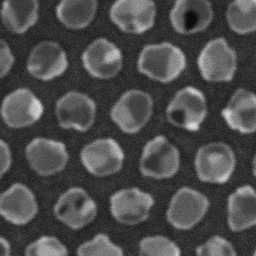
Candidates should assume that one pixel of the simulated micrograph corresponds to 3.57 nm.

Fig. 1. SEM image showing a regular array of raised bodies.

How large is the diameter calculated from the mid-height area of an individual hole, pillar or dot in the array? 136 nm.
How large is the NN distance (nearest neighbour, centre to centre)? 0.193 um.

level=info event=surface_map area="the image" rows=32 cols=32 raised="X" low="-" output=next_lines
-XXXX---XXXX---XXXX---XXXX---XXX
XXXX---XXXXX--XXXXX---XXXXX-XXXX
XXXX----XXX---XXXXX--XXXXX--XXXX
-XX------X-----XXX----XXXX---XXX
--------------------------------
X----XX----XXX------------XX----
X---XXXX---XXXX---XXXXX--XXXX---
X---XXXX---XXXX---XXXXX--XXXX---
X---XXXX---XXXX---XXXXX--XXXX---
----XXX-----XX-----XXX---XXXX---
--------------------------------
--XX------------XX-----XX-----X-
-XXXX---XXX----XXXX---XXX----XXX
XXXXX--XXXXX--XXXXX--XXXXX--XXXX
XXXXX--XXXXX--XXXXX--XXXX---XXXX
-XXX---XXXX----XXX----XXX----XXX
--------------------------------
----XX-------------XX-----------
X--XXXXX---XXXX---XXXX---XXXX---
X--XXXXX--XXXXX---XXXX---XXXX---
X---XXXX---XXXX---XXXX---XXXX---
-----XX-----XX----XXXX---XXXX---
--------------------------XX----
--X---------------------------X-
XXXX----XXX---XXXXX---XXX----XXX
XXXX---XXXXX--XXXXX--XXXXX---XXX
XXXX---XXXXX--XXXX---XXXXX---XXX
-XXX----XXX----XXX---XXXX----XXX
-----------------------------XX-
------------X-------------------
X---XXXX--XXXX----XXXX----XXX---
X--XXXXX--XXXXX---XXXX---XXXX---